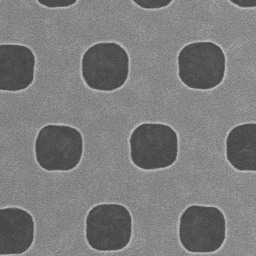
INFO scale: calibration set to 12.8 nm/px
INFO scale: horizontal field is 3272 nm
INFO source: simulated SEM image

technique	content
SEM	holes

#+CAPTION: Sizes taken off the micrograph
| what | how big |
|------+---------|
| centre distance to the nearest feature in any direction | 93.1 pixels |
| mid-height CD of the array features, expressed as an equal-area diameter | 623 nanometres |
